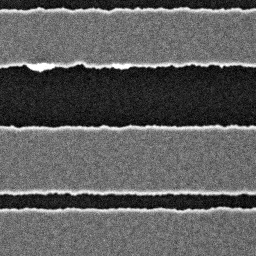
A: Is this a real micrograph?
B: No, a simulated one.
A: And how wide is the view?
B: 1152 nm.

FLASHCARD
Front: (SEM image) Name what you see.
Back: lines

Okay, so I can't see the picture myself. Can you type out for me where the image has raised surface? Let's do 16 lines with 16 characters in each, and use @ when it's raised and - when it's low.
@@@@@@@@@@@@@@@@
@@@@@@@@@@@@@@@@
@@@@@@@@@@@@@@@@
@@@@@@@@@@@@@@@@
----------------
----------------
----------------
----------------
@@@@@@@@@@@@@@@@
@@@@@@@@@@@@@@@@
@@@@@@@@@@@@@@@@
@@@@@@@@@@@@@@@@
@@@@@@@@@@@@@@@@
@@@@@@@@@@@@@@@@
@@@@@@@@@@@@@@@@
@@@@@@@@@@@@@@@@